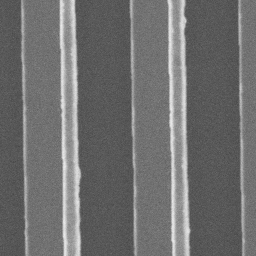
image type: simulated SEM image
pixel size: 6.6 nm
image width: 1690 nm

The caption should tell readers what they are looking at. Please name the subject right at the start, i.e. lines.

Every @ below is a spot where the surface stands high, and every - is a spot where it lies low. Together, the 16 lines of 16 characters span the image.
-@@@@---@@@----@
-@@@@---@@@@---@
-@@@@---@@@----@
-@@@@---@@@----@
-@@@@---@@@@---@
-@@@@---@@@@---@
-@@@@---@@@@---@
-@@@@---@@@@---@
--@@@---@@@@---@
--@@@---@@@@---@
--@@@---@@@@---@
--@@@---@@@@---@
--@@@---@@@@---@
--@@@---@@@@---@
--@@@---@@@@---@
--@@@---@@@@---@